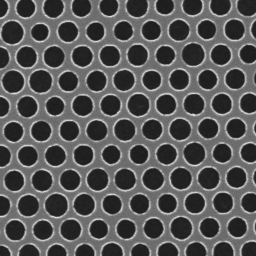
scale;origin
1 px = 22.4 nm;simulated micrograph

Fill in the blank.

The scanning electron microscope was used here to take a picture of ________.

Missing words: a regular array of holes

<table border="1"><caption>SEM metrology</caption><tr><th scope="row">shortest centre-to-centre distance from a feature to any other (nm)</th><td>619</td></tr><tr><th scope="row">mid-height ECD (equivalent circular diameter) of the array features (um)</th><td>0.458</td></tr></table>